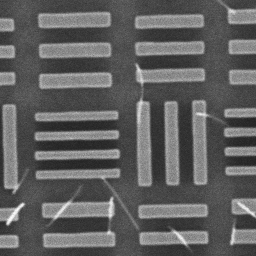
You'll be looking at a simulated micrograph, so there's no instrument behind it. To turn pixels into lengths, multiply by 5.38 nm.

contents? groups of lines, slits or small figures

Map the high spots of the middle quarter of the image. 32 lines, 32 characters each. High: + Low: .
................................
..................+....+++++++++
..+++++++++.......++++++++++++++
++++++++++++......++++++++++++++
++++++++++++.......+++++........
++++++++++++....................
................................
................................
................................
...................+............
..................+++....+++....
..................+++....+++....
+++++++++++++.....+++....+++....
+++++++++++++.....+++....+++....
..................+++....+++....
..................+++....+++....
..................+++....+++....
++++++++++++++....+++....+++....
+++++++++++++.....+++....++++...
..................++++...++++...
..................++++...++++...
...........+++....++++...++++...
++++++++++++++....++++...++++...
+++++...++........++++...++++...
..................++++...++++...
..................++++....+++...
++++++++++++++.....+++....+++...
++++++++++++++.....+++....+++...
.........+.........+++....+++...
...................+++....+++...
................................
................................